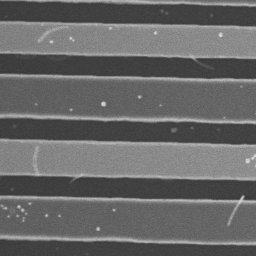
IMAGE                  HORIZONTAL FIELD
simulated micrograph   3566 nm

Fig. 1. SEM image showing lines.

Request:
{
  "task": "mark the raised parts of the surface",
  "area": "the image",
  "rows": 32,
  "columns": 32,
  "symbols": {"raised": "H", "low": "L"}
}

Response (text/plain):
LLLLLLLLLLLLLLLLLLLLLLLLLHHHHHHH
LLLLLLLLLLLLLLLLLLLLLLLLLLLLLLLL
LLLLLLLLLLLLLLLLLLLLLLLLLLLLLLLL
HHHHHHHHHHHHHHHHHHHHHHHHHHHHHHHH
HHHHHHHHHHHHHHHHHHHHHHHHHHHHHHHH
HHHHHHHHHHHHHHHHHHHHHHHHHHHHHHHH
HHHHHHHHHHHHHHHHHHHHHHHHHHHHHHHH
LLLLLLLLLLLLLLLLLLLLLLLLLLLLLLLL
LLLLLLLLLLLLLLLLLLLLLLLLLLLLLLLL
HHHHHHHHLLLLLLLLLLLLLLLLLLLLLLLL
HHHHHHHHHHHHHHHHHHHHHHHHHHHHHHHH
HHHHHHHHHHHHHHHHHHHHHHHHHHHHHHHH
HHHHHHHHHHHHHHHHHHHHHHHHHHHHHHHH
HHHHHHHHHHHHHHHHHHHHHHHHHHHHHHHH
HHHHHHHHHHHHHHHHHHHHHHHHHHHHHHHH
LLLLLLLLLLLLLLLLLLLLLLLLLLLLLLLL
LLLLLLLLLLLLLLLLLLLLLLLLLLLLLLLL
HLLLLLLLLLLLLLLLLLLLLLLLLLLLLLLL
HHHHHHHHHHHHHHHHHHHHHHHHHHHHHHHH
HHHHHHHHHHHHHHHHHHHHHHHHHHHHHHHH
HHHHHHHHHHHHHHHHHHHHHHHHHHHHHHHH
HHHHHHHHHHHHHHHHHHHHHHHHHHHHHHHH
LLLLLLLLLLLLLLLLLLLLLLLLLLLLLLLH
LLLLLLLLLLLLLLLLLLLLLLLLLLLLLLLL
LLLLLLLLLLLLLLLLLLLLLLLLLLLLLLLL
HHHHHHHHHHHHHHHHHHHHHHHHHHHHHHHH
HHHHHHHHHHHHHHHHHHHHHHHHHHHHHHHH
HHHHHHHHHHHHHHHHHHHHHHHHHHHHHHHH
HHHHHHHHHHHHHHHHHHHHHHHHHHHHHHHH
HHHHHHHHHHHHHHHHHHHHHHHHHHHHHHHH
LLLLLLLLLLLLLLLLLLLLLLLLLHHHHHHH
LLLLLLLLLLLLLLLLLLLLLLLLLLLLLLLL